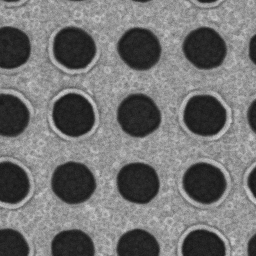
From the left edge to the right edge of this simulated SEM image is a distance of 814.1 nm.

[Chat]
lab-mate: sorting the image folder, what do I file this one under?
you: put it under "a regular array of holes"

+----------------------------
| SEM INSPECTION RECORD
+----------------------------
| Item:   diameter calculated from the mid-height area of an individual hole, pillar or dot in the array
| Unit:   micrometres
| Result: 0.134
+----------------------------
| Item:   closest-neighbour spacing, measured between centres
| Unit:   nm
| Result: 207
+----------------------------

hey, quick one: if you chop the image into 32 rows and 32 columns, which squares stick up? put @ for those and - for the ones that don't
@@@@@@@@@@@@@@@@@@@@@@@@@@@@@@@@
@@@@@@@@@@@@@@@@@@@@@@@@@@@@@@@@
@@@@@@@@@@@@@@@@@@@@@@@@@@@@@@@@
--@@@@@@-@@@@@@@@@@@@@@@@-@@@@@@
---@@@@----@@@@----@@@@-----@@@@
----@@@-----@@@-----@@@-----@@@-
----@@@-----@@@-----@@@-----@@@-
---@@@@----@@@@-----@@@@----@@@-
--@@@@@@@-@@@@@@@--@@@@@@--@@@@@
@@@@@@@@@@@@@@@@@@@@@@@@@@@@@@@@
@@@@@@@@@@@@@@@@@@@@@@@@@@@@@@@@
@@@@@@@@@@@@@@@@@@@@@@@@@@@@@@@@
---@@@@----@@@@@---@@@@@---@@@@@
---@@@@-----@@@-----@@@-----@@@-
----@@@-----@@@-----@@@-----@@@-
---@@@@-----@@@-----@@@-----@@@-
---@@@@@---@@@@@---@@@@@---@@@@@
@@@@@@@@@@@@@@@@@@@@@@@@@@@@@@@@
@@@@@@@@@@@@@@@@@@@@@@@@@@@@@@@@
@@@@@@@@@@@@@@@@@@@@@@@@@@@@@@@@
--@@@@@@--@@@@@@--@@@@@@--@@@@@@
---@@@@----@@@@----@@@@-----@@@-
----@@@-----@@@-----@@@-----@@@-
----@@@-----@@@-----@@@-----@@@-
---@@@@----@@@@----@@@@@----@@@@
@@@@@@@@@@@@@@@@@@@@@@@@@@@@@@@@
@@@@@@@@@@@@@@@@@@@@@@@@@@@@@@@@
@@@@@@@@@@@@@@@@@@@@@@@@@@@@@@@@
@@@@@@@@@@@@@@@@@@@@@@@@@@@@@@@@
---@@@@----@@@@----@@@@----@@@@@
---@@@------@@@-----@@@-----@@@-
----@@------@@@-----@@@-----@@@-